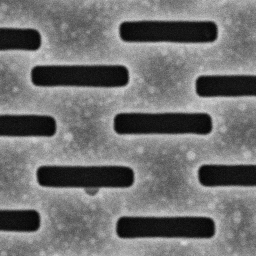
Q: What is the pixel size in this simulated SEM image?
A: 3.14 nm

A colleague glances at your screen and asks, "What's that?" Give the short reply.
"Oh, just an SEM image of holes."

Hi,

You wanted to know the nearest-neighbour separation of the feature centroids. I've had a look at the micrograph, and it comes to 295 nm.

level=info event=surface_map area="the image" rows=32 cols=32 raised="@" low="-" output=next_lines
@@@@@@@@@@@@@@@@@@@@@@@@@@@@@@@@
@@@@@@@@@@@@@@@@@@@@@@@@@@@@@@@@
@@@@@@@@@@@@@@@@@@@@@@@@@@@@@@@@
-@@@@@@@@@@@@@@------------@@@@@
-----@@@@@@@@@@------------@@@@@
-----@@@@@@@@@@@@@@@@@@@@@@@@@@@
@@@@@@@@@@@@@@@@@@@@@@@@@@@@@@@@
@@@@@@@@@@@@@@@@@@@@@@@@@@@@@@@@
@@@@------------@@@@@@@@@@@@@@@@
@@@@------------@@@@@@@@@-------
@@@@------------@@@@@@@@--------
@@@@@@@@@@@@@@@@@@@@@@@@@-------
@@@@@@@@@@@@@@@@@@@@@@@@@@@@@@@@
@@@@@@@@@@@@@@@@@@@@@@@@@@@@@@@@
------@@@@@@@@@-----------@@@@@@
-------@@@@@@@-------------@@@@@
-------@@@@@@@@-----------@@@@@@
@@@@@@@@@@@@@@@@@@@@@@@@@@@@@@@@
@@@@@@@@@@@@@@@@@@@@@@@@@@@@@@@@
@@@@@@@@@@@@@@@@@@@@@@@@@@@@@@@@
@@@@@@@@@@@@@@@@@@@@@@@@@@@@@@@@
@@@@@------------@@@@@@@@-------
@@@@@------------@@@@@@@@-------
@@@@@@@---------@@@@@@@@@@@@@@@@
@@@@@@@@@@@@@@@@@@@@@@@@@@@@@@@@
@@@@@@@@@@@@@@@@@@@@@@@@@@@@@@@@
-----@@@@@@@@@@@@@@@@@@@@@@@@@@@
-----@@@@@@@@@@------------@@@@@
-----@@@@@@@@@-------------@@@@@
@@@@@@@@@@@@@@@------------@@@@@
@@@@@@@@@@@@@@@@@@@@@@@@@@@@@@@@
@@@@@@@@@@@@@@@@@@@@@@@@@@@@@@@@